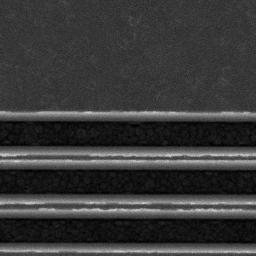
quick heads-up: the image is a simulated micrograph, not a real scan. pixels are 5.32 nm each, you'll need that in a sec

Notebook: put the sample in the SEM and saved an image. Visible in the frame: parallel lines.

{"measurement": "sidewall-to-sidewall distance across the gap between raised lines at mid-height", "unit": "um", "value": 0.168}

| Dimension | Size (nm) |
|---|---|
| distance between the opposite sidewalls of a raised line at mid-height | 89.2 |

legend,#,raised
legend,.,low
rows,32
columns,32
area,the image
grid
################################
################################
################################
################################
################################
################################
################################
################################
################################
################################
################################
################################
################################
################################
################################
................................
................................
................................
................................
################################
################################
................................
................................
................................
................................
################################
################################
................................
................................
................................
................................
################################